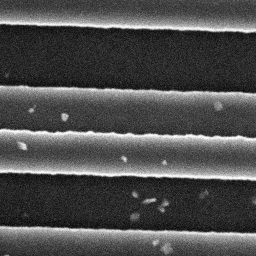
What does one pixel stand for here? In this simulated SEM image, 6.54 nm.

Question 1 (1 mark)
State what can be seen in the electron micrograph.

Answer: lines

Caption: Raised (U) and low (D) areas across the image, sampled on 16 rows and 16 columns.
UUUUUUUUUUUUUUUU
UUUUUUUUUUUUUUUU
DDDDDDDDDDDDDDDD
DDDDDDDDDDDDDDDD
DDDDDDDDDDDDDDDD
UUDDDDDDDDDDDDDD
UUUUUUUUUUUUUUUU
UUUUUUUUUUUUUUUU
UUUUUUUUUUUUUUUU
UUUUUUUUUUUUUUUU
UUUUUUUUUUUUUUUU
DDDDDDDDDDDDDDDD
DDDDDDDDDDDDDDDD
DDDDDDDDDDDDDDDD
UUUUUUUUUUDDDDDD
UUUUUUUUUUUUUUUU